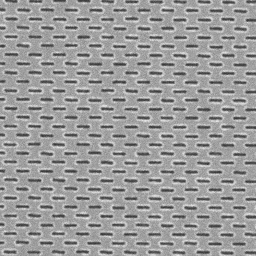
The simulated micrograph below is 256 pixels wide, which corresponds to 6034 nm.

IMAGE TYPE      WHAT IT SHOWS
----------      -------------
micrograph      a regular array of holes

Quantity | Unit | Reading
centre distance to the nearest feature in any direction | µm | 0.344